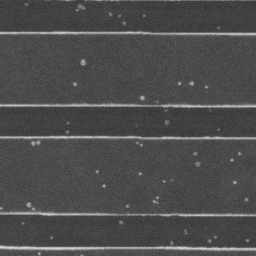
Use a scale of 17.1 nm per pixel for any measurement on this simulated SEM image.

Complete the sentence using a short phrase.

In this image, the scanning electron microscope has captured lines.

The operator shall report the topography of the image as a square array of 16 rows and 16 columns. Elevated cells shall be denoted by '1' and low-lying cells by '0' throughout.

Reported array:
0000000000000000
0000000000000000
1111111111111111
1111111111111111
1111111111111111
1111111111111111
1111111111111111
0000000000000000
0000000000000000
1111111111111111
1111111111111111
1111111111111111
1111111111111111
0000000000000000
0000000000000000
1110011111000000